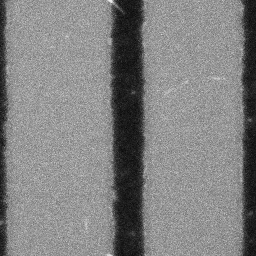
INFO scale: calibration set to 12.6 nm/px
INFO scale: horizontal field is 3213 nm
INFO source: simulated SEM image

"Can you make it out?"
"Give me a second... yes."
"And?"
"one or a few lines or trenches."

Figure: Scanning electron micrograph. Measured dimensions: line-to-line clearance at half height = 1240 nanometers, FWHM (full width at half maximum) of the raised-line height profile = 0.422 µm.